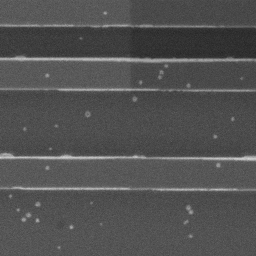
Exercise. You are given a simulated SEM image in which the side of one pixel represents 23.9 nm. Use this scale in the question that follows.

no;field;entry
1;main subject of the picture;lines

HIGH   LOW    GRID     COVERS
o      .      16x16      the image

oooooooooooooooo
oooooooooooooooo
................
................
oooooooooooooooo
oooooooooooooooo
................
................
................
................
oooooooooooooooo
oooooooooooooooo
................
................
................
................